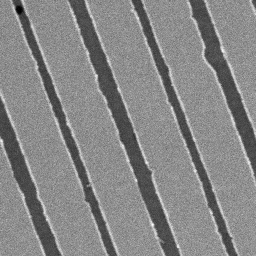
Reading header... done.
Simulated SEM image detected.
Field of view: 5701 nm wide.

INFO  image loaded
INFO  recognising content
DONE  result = parallel lines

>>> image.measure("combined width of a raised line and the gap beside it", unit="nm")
1240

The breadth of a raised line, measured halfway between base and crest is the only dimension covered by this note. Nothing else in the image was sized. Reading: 935 nm